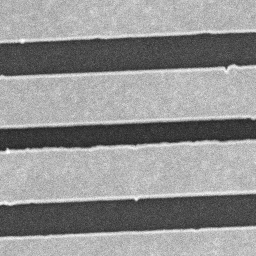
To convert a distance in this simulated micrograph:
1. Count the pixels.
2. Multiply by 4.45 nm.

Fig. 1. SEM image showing one or a few lines or trenches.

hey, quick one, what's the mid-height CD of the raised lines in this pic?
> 0.229 micrometres